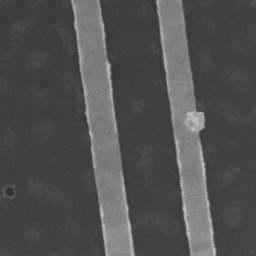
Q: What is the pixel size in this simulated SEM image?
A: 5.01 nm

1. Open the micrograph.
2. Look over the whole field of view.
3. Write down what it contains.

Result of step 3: one or a few lines or trenches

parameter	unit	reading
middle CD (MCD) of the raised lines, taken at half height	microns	0.134